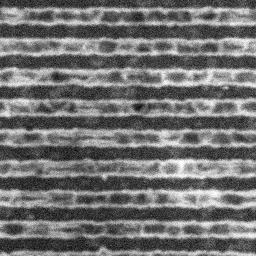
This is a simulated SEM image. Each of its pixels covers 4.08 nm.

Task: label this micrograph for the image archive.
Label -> parallel lines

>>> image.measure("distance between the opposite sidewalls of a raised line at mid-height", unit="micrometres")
0.0566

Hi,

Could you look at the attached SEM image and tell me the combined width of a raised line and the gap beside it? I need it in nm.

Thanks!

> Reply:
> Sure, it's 124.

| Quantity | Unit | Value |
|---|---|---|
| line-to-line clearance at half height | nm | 64.7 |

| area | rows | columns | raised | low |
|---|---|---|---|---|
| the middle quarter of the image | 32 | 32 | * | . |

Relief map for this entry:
................................
.*..........**.**...............
********************************
********************************
********************************
................................
................................
................................
................................
******.**********.**************
********************************
********************************
****************...******.******
................................
................................
................................
................................
********************************
********************************
********************************
...............*................
................................
................................
................................
...***************.**.**..******
********************************
********************************
*****.**.*...*******************
................................
................................
................................
................................